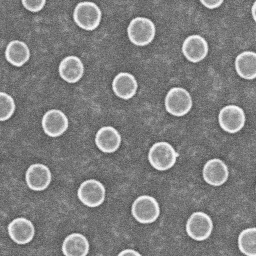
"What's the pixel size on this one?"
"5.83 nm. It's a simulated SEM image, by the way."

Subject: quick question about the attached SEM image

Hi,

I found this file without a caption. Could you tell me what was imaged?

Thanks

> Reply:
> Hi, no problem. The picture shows a regular array of raised bodies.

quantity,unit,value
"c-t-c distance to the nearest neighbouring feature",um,0.326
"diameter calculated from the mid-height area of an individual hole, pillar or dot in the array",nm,144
